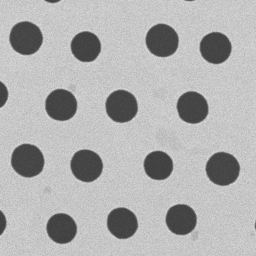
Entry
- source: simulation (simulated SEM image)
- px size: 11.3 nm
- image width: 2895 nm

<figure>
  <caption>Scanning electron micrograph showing a regular array of holes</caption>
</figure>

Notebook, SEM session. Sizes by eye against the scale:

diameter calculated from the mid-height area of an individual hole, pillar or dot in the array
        368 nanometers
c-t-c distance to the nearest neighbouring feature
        0.675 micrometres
